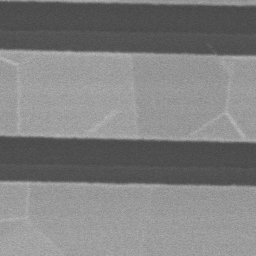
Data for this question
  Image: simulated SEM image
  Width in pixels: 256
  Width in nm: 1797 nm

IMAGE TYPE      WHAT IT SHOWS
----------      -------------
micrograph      lines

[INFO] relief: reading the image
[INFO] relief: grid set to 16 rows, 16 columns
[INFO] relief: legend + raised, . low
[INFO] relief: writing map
................
................
................
++++++++++++++..
++++++++++++++++
++++++++++++++++
++++++++++++++++
++++++++++++++++
..++++++++++++++
................
................
+++++++.+.......
++++++++++++++++
++++++++++++++++
++++++++++++++++
++++++++++++++++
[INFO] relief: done